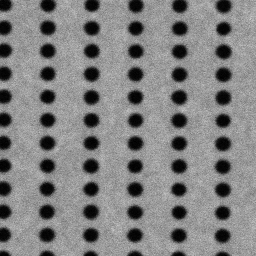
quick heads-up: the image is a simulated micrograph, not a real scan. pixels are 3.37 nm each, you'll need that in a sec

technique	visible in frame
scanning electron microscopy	a regular array of holes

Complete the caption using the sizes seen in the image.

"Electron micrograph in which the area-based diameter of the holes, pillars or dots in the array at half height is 47.4 nm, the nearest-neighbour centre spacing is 77 nm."